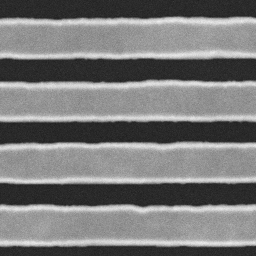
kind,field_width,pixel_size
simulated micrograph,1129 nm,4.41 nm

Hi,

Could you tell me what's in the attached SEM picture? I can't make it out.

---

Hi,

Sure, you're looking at lines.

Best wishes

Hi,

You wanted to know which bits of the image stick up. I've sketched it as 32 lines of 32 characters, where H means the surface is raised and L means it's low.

LLLLLLLLLLLLLLLLLLLLLLLLLLLLLLLL
LLLLLLLLLLLLLLLLLLLLLLLLLLLLLLLL
HHHHHHHHHHHHHHHHHHHHHHHHHHHHHHHH
HHHHHHHHHHHHHHHHHHHHHHHHHHHHHHHH
HHHHHHHHHHHHHHHHHHHHHHHHHHHHHHHH
HHHHHHHHHHHHHHHHHHHHHHHHHHHHHHHH
HHHHHHHHHHHHHHHHHHHHHHHHHHHHHHHH
LLLLLLLLLLLLLLLLLLLLLLLLLLLLLLLL
LLLLLLLLLLLLLLLLLLLLLLLLLLLLLLLL
LLLLLLLLLLLLLLLLLLLLLLLLLLLLLLLL
HHHHHHHHHHHHHHHHHHHHHHHHHHHHHHHH
HHHHHHHHHHHHHHHHHHHHHHHHHHHHHHHH
HHHHHHHHHHHHHHHHHHHHHHHHHHHHHHHH
HHHHHHHHHHHHHHHHHHHHHHHHHHHHHHHH
HHHHHHHHHHHHHHHHHHHHHHHHHHHHHHHH
LLLLLLLLLLLLLLLLLLLLLLLLLLLLLLLL
LLLLLLLLLLLLLLLLLLLLLLLLLLLLLLLL
LLLLLLLLLLLLLLLLLLLLLLLLLLLLLLLL
HHHHHHHHHHHHHHHHHHHHHHHHHHHHHHHH
HHHHHHHHHHHHHHHHHHHHHHHHHHHHHHHH
HHHHHHHHHHHHHHHHHHHHHHHHHHHHHHHH
HHHHHHHHHHHHHHHHHHHHHHHHHHHHHHHH
HHHHHHHHHHHHHHHHHHHHHHHHHHHHHHHH
LLLLLLLLLLLLLLLLLLLLLLLLLLLLLLLL
LLLLLLLLLLLLLLLLLLLLLLLLLLLLLLLL
LLLLLLLLLLLLLLLLLLLLLLLLLLLLLLLL
HHHHHHHHHHHHHHHHHHHHHHHHHHHHHHHH
HHHHHHHHHHHHHHHHHHHHHHHHHHHHHHHH
HHHHHHHHHHHHHHHHHHHHHHHHHHHHHHHH
HHHHHHHHHHHHHHHHHHHHHHHHHHHHHHHH
HHHHHHHHHHHHHHHHHHHHHHHHHHHHHHHH
LLLLLLLLLLLLLLLLLLLLLLLLLLLLLLLL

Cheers